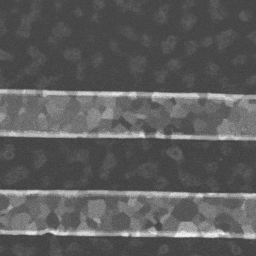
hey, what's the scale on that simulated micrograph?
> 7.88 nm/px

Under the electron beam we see one or a few lines or trenches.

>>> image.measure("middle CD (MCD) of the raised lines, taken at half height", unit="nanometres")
324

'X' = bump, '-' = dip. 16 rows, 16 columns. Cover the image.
----------------
----------------
----------------
----------------
----------------
----------------
XXXXXXXXXXXXXXXX
XXXXXXXXXXXXXXXX
-------XX-XXXXXX
----------------
----------------
----------------
XXXXXXXXXXXXXXXX
XXXXXXXXXXXXXXXX
XXXXXXXXXXXXXXXX
----------------